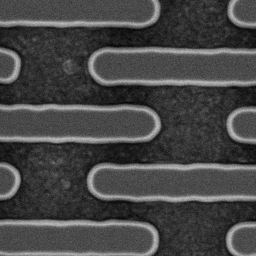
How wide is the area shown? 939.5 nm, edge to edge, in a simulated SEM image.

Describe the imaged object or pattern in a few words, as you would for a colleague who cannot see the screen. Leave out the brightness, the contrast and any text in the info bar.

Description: groups of lines, slits or small figures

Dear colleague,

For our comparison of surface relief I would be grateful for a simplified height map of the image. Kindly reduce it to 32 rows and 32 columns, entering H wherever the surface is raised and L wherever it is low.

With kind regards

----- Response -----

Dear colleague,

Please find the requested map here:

HHHHHHHHHHHHHHHHHHHHLLLLLLLLLHHH
HHHHHHHHHHHHHHHHHHHHLLLLLLLLLHHH
HHHHHHHHHHHHHHHHHHHLLLLLLLLLLHHH
LLLLLLLLLLLLLLLLLLLLLLLLLLLLLLLL
LLLLLLLLLLLLLLLLLLLLLLLLLLLLLLLL
LLLLLLLLLLLLLLLLLLLLLLLLLLLLLLLL
HLLLLLLLLLLLHHHHHHHHHHHHHHHHHHHH
HHLLLLLLLLLHHHHHHHHHHHHHHHHHHHHH
HHLLLLLLLLLHHHHHHHHHHHHHHHHHHHHH
HHLLLLLLLLLLHHHHHHHHHHHHHHHHHHHH
LLLLLLLLLLLLLHHLLLLLLLLLLHHHHHHH
LLLLLLLLLLLLLLLLLLLLLLLLLLLLLLLL
LLLLLLLLLLLLLLLLLLLLLLLLLLLLLLLL
HHHHHHHHHHHHHHHHHHLLLLLLLLLLLLLL
HHHHHHHHHHHHHHHHHHHLLLLLLLLLLHHH
HHHHHHHHHHHHHHHHHHHHLLLLLLLLLHHH
HHHHHHHHHHHHHHHHHHHHLLLLLLLLLHHH
LLLLLLHHLHHHHHHHHHLLLLLLLLLLLLHH
LLLLLLLLLLLLLLLLLLLLLLLLLLLLLLLL
LLLLLLLLLLLLLLLLLLLLLLLLLLLLLLLL
LLLLLLLLLLLLLLLLLLLLLLLLLLLLLLLL
HHLLLLLLLLLHHHHHHHHHHHHHHHHHHHHH
HHLLLLLLLLLHHHHHHHHHHHHHHHHHHHHH
HHLLLLLLLLLHHHHHHHHHHHHHHHHHHHHH
HLLLLLLLLLLLHHHHHHHHHHHHHHHHHHHH
LLLLLLLLLLLLLLLLLLLLLLLLLLLLLLLL
LLLLLLLLLLLLLLLLLLLLLLLLLLLLLLLL
LLLLLLLLLLLLLLLLLLLLLLLLLLLLLLLL
HHHHHHHHHHHHHHHHHHHLLLLLLLLLLHHH
HHHHHHHHHHHHHHHHHHHHLLLLLLLLLHHH
HHHHHHHHHHHHHHHHHHHHLLLLLLLLLHHH
HHHHHHHHHHHHHHHHHHHLLLLLLLLLLHHH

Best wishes